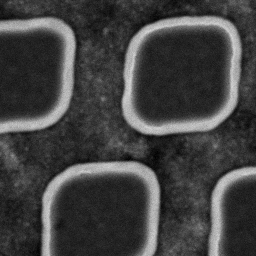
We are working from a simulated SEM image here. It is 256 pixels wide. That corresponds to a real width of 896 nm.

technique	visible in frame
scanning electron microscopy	raised bodies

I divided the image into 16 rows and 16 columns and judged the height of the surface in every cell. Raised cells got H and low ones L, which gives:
LLLLLLLLLLLLLLLL
LLHLLLLLLLHHHHLL
HHHHLLLLLHHHHHHL
HHHHLLLLHHHHHHHL
HHHHLLLLHHHHHHHL
HHHHLLLLHHHHHHHL
HHHHLLLLHHHHHHLL
HHHLLLLLHHHHHHLL
LLLLLLLLLLLLLLLL
LLLLLLLLLLLLLLLL
LLLLLLHHLLLLLLLL
LLLHHHHHHHLLLLHH
LLLHHHHHHHLLLLHH
LLLHHHHHHHLLLLHH
LLLHHHHHHHLLLHHH
LLLHHHHHHLLLLHHH